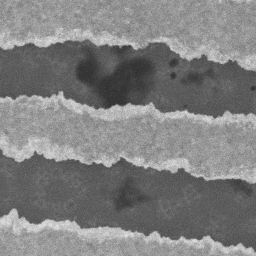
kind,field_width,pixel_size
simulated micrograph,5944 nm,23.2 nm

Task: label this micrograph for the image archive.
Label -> one or a few lines or trenches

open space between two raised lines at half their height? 1600 nanometres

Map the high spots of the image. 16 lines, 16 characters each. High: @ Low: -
@@@@@@@@@@@@@@@@
@@@@@@@@@@@@@@@@
@@@@--@@@@@@@@@@
-------------@@@
----------------
----------------
@@@@------------
@@@@@@@@@@@@@-@@
@@@@@@@@@@@@@@@@
---@@@@@@@@@@@@@
------------@@@@
----------------
----------------
----------------
@@@@@-----------
@@@@@@@@@@@@@@--